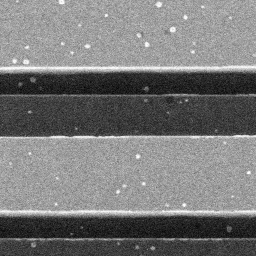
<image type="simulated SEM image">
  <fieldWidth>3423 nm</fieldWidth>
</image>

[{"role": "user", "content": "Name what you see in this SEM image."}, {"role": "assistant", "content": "lines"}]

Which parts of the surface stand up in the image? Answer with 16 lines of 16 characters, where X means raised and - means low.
XXXXXXXXXXXXXXXX
XXXXXXXXXXXXXXXX
XXXXXXXXXXXXXXXX
XXXXXXXXXXXXXXXX
----------------
----------------
----------------
----------------
--------------XX
XXXXXXXXXXXXXXXX
XXXXXXXXXXXXXXXX
XXXXXXXXXXXXXXXX
XXXXXXXXXXXXXXXX
----------------
----------------
----------------